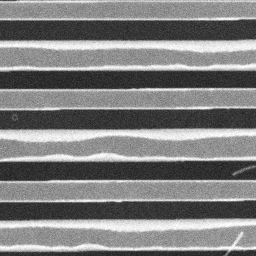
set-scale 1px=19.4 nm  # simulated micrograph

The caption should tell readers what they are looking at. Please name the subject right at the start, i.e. lines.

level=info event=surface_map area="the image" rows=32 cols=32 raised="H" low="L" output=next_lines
HHHHHHHHHHHHHHHHHHHHHHHHHHHHHHHH
HHHHHHHHHHHHHHHHHHHHHHHHHHHHHHHH
LLLLLLLLLLLLLLLLLLLLLLLLLLLLLLLL
LLLLLLLLLLLLLLLLLLLLLLLLLLLLLLLL
LLLLLLLLLLLLLLLLLLLLLLLLLLLLLLLL
HHHHHHHHHHHHHHHHHHHHHHHHHLLHHHHH
HHHHHHHHHHHHHHHHHHHHHHHHHHHHHHHH
HHHHHHHHHHHHHHHHHHHHHHHHHHHHHHHH
HHHHHHHHHHHHHHHHHHHHHHHHHHHHHHHH
LLLLLLLLLLLLLLLLLLLLLLLLLLLLLLLL
LLLLLLLLLLLLLLLLLLLLLLLLLLLLLLLL
HHHHHHHHHHHHHHHHHHHHHHHHHHHHHHHH
HHHHHHHHHHHHHHHHHHHHHHHHHHHHHHHH
HHHHHHHHHHHHHHHHHHHHHHHHHHHLLLLL
LLLLLLLLLLLLLLLLLLLLLLLLLLLLLLLL
LLLLLLLLLLLLLLLLLLLLLLLLLLLLLLLL
LLLLLLLLLLLLLLLLLLLLLLLLLLLLHHHH
HHHHHHHHHHHHHHHHHHHHHHHHHHHHHHHH
HHHHHHHHHHHHHHHHHHHHHHHHHHHHHHHH
HHHHHHHHHHHHHHHHHHHHHHHHHHHHHHHH
LLLLLLLLLLLLLLLLLLLLLLLLLLLLLLLL
LLLLLLLLLLLLLLLLLLLLLLLLLLLLLLLL
LLLLLLLLLLLLLLLLLLLLLLLLLLLLLLLL
HHHHHHHHHHHHHHHHHHHHHHHHHHHHHHHH
HHHHHHHHHHHHHHHHHHHHHHHHHHHHHHHH
LLLLLLLLLLLLLLLLLLLLLLLLLLLLLLLL
LLLLLLLLLLLLLLLLLLLLLLLLLLLLLLLL
LLLLLLLLLLLLLLLLLLLLLLLLLLLLLLLL
HHHHHHHHHHHHHHHHHHHHHHHHHHHHHHHH
HHHHHHHHHHHHHHHHHHHHHHHHHHHHHHHH
HHHHHHHHHHHHHHHHHHHHHHHHHHHHHHHH
LLLLLLLLLLLLLLLLLLLLLLLLLLLLLLLL